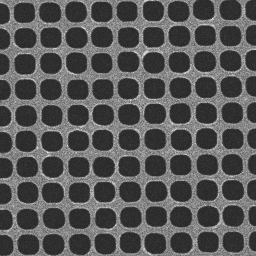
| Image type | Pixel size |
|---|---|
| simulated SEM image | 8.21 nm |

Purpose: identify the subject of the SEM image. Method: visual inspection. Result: a regular array of holes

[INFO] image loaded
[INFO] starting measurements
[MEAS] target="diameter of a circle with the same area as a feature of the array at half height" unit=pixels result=22.1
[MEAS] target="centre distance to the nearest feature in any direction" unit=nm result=207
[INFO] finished